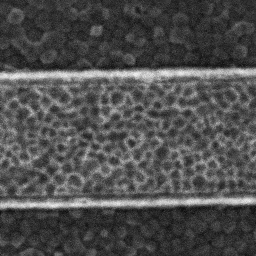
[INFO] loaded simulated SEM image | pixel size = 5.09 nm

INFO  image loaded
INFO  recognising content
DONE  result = one or a few lines or trenches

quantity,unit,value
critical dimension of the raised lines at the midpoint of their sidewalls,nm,653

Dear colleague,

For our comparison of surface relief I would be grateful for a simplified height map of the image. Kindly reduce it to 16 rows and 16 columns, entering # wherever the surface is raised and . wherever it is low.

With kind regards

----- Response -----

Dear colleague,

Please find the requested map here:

................
................
................
................
................
################
################
################
################
################
################
################
################
................
................
................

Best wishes